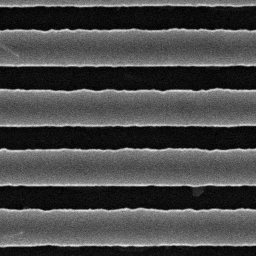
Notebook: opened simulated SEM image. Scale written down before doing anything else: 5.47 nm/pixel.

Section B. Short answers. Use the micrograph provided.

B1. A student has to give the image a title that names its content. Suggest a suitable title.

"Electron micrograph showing lines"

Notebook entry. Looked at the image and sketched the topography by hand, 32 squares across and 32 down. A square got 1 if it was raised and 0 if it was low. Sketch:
11111111111111111111111111111111
00000000000000000000000000000000
00000000000000000000000000000000
00000000000000000000000000000000
11111111111111111111111111111111
11111111111111111111111111111111
11111111111111111111111111111111
11111111111111111111111111111111
00000000000000000000000000000000
00000000000000000000000000000000
00000000000000000000000000000000
11111111111111111111111111111111
11111111111111111111111111111111
11111111111111111111111111111111
11111111111111111111111111111111
11111111111111111111111111111111
00000000000000000000000000000000
00000000000000000000000000000000
00000000000000000000000000000000
11111111111111111111111111111111
11111111111111111111111111111111
11111111111111111111111111111111
11111111111111111111111111111111
00000000000000000000000000000000
00000000000000000000000000000000
00000000000000000000000000000000
11111111111111111111111111111111
11111111111111111111111111111111
11111111111111111111111111111111
11111111111111111111111111111111
11111111111111111111111111111111
00000000000000000000000000000000